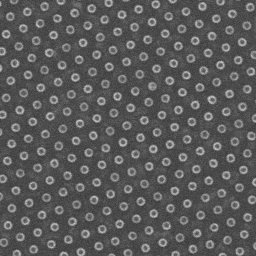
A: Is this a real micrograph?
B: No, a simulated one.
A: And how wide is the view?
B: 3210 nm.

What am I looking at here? a regular array of raised bodies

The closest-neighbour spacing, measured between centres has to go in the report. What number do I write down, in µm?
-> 0.216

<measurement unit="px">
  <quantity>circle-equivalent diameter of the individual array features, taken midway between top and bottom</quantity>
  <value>7.66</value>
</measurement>